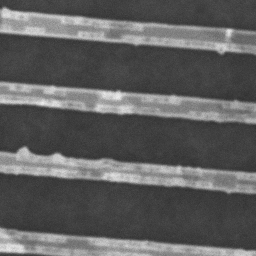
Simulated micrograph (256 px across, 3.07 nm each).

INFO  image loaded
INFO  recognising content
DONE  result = one or a few lines or trenches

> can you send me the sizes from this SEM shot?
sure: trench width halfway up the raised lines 160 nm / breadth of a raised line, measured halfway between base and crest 58.9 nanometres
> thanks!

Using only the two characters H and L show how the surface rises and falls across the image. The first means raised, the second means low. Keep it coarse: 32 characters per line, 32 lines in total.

LLLLLLLLLLLLLLLLLLLLLLLLLLLLLLLL
HHLLLLLLLLLLLLLLLLLLLLLLLLLLLLLL
HHHHHHHHHHHHLLLLLLLLLLLLLLLLLLLL
HHHHHHHHHHHHHHHHHHHHHHHHLLLLLLLL
LLLLLLLLHHHHHHHHHHHHHHHHHHHHHHHH
LLLLLLLLLLLLLLLLHHLLHHHHHHHHHHHH
LLLLLLLLLLLLLLLLLLLLLLLLLLLHLLLH
LLLLLLLLLLLLLLLLLLLLLLLLLLLLLLLL
LLLLLLLLLLLLLLLLLLLLLLLLLLLLLLLL
LLLLLLLLLLLLLLLLLLLLLLLLLLLLLLLL
LLHLLLLLLLLLLLLLLLLLLLLLLLLLLLLL
HHHHHHHHHHHLLLLLLLLLLLLLLLLLLLLL
HHHHHHHHHHHHHHHHHHHHHHHHHLLLLLLL
LLLLLLLLLHHHHHHHHHHHHHHHHHHHHHHH
LLLLLLLLLLLLLLLLLLLLLLLHHHHHHHHH
LLLLLLLLLLLLLLLLLLLLLLLLLLLLLLLL
LLLLLLLLLLLLLLLLLLLLLLLLLLLLLLLL
LLLLLLLLLLLLLLLLLLLLLLLLLLLLLLLL
LLLLLLLLLLLLLLLLLLLLLLLLLLLLLLLL
HHHHHLHHLLLLLLLLLLLLLLLLLLLLLLLL
HHHHHHHHHHHHHHHHHLLLLLLLLLLLLLLL
HHHHHHHHHHHHHHHHHHHHHHHHHHHLLLLL
LLLLLLLLLLLLLHHHHHHHHHHHHHHHHHHH
LLLLLLLLLLLLLLLLLLLLLLLLLLHHHHHH
LLLLLLLLLLLLLLLLLLLLLLLLLLLLLLLL
LLLLLLLLLLLLLLLLLLLLLLLLLLLLLLLL
LLLLLLLLLLLLLLLLLLLLLLLLLLLLLLLL
LLLLLLLLLLLLLLLLLLLLLLLLLLLLLLLL
LLLLLLLLLLLLLLLLLLLLLLLLLLLLLLLL
HHHHHHHLLLLLLLLLLLLLLLLLLLLLLLLL
HHHHHHHHHHHHHHHHHHHHLLLLLLLLLLLL
LLLLHHHHHHHHHHHHHHHHHHHHHHHHHHHH